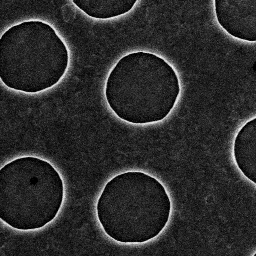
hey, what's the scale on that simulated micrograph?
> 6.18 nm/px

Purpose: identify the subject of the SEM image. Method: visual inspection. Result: holes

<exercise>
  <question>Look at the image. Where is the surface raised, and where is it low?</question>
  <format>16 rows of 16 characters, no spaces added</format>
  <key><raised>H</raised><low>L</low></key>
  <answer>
HHHHHLLLHHHHHLLL
HLLHHHHHHHHHHHLL
LLLLHHHHHHHHHHHL
LLLLHHHHLLHHHHHH
LLLLHHHLLLLHHHHH
HLLHHHHLLLLHHHHH
HHHHHHHLLLLHHHHH
HHHHHHHHLLHHHHHH
HHHHHHHHHHHHHHHL
HHHHHHHHHHHHHHHL
LLLHHHHHHHHHHHHL
LLLLHHHLLLHHHHHH
LLLLHHLLLLLHHHHH
LLLHHHLLLLLHHHHH
HHHHHHHLLLHHHHHH
HHHHHHHHHHHHHHHH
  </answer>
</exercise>